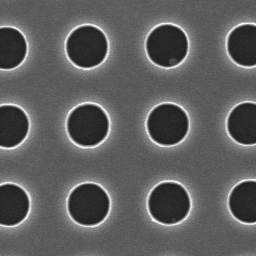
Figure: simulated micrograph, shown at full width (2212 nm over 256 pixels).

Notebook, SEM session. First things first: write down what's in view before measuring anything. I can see holes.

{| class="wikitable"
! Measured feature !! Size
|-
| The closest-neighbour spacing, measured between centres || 680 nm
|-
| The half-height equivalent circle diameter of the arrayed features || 42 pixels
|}